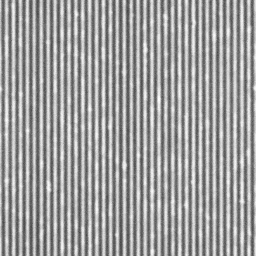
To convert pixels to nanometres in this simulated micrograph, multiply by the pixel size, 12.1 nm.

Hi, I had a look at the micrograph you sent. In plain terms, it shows parallel lines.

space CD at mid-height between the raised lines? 4.25 pixels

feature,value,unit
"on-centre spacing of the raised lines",84.1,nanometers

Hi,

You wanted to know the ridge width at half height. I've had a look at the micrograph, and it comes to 0.0303 um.